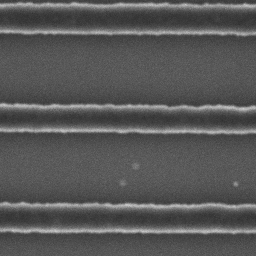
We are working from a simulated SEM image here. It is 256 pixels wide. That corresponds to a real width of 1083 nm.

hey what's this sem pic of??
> lines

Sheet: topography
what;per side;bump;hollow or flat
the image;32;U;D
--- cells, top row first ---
DDUUDDDDDUDDDDDDDDDDUDDDDDDDDDDD
UUUUUUUUUUUUUUUUUUUUUUUUUUUUUUUU
UUUUUUUUUUUUUUUUUUUUUUUUUUUUUUUU
UUUUUUUUUUUUUUUUUUUUUUUUUUUUUUUU
DDDDDDDDDDDDDDDDDDDDDDDDDDDDDDDD
DDDDDDDDDDDDDDDDDDDDDDDDDDDDDDDD
DDDDDDDDDDDDDDDDDDDDDDDDDDDDDDDD
DDDDDDDDDDDDDDDDDDDDDDDDDDDDDDDD
DDDDDDDDDDDDDDDDDDDDDDDDDDDDDDDD
DDDDDDDDDDDDDDDDDDDDDDDDDDDDDDDD
DDDDDDDDDDDDDDDDDDDDDDDDDDDDDDDD
DDDDDDDDDDDDDDDDDDDDDDDDDDDDDDDD
DDDDDDDDDDDDDDDDDDDDDDDDDDDDDDDD
UUUUUUUUUUUUUUUUUUUUUUUUUUUUUUUU
UUUUUUUUUUUUUUUUUUUUUUUUUUUUUUUU
UUUUUUUUUUUUUUUUUUUUUUUUUUUUUUUU
DDDDDDDUDDDDDDUUDUUUUUUUUUUUUUUU
DDDDDDDDDDDDDDDDDDDDDDDDDDDDDDDD
DDDDDDDDDDDDDDDDDDDDDDDDDDDDDDDD
DDDDDDDDDDDDDDDDDDDDDDDDDDDDDDDD
DDDDDDDDDDDDDDDDDDDDDDDDDDDDDDDD
DDDDDDDDDDDDDDDDDDDDDDDDDDDDDDDD
DDDDDDDDDDDDDDDDDDDDDDDDDDDDDDDD
DDDDDDDDDDDDDDDDDDDDDDDDDDDDDDDD
DDDDDDDDDDDDDDDDDDDDDDDDDDDDDDDD
UUUUUUUUUUUUUUDUUDDDDDDDDUUUDDDD
UUUUUUUUUUUUUUUUUUUUUUUUUUUUUUUU
UUUUUUUUUUUUUUUUUUUUUUUUUUUUUUUU
UUUUUUUUUUUUUUUUUUUUUUUUUUUUUUUU
DDDDDDDDDDDDDDDDDDDDDDDDDDDDDDDD
DDDDDDDDDDDDDDDDDDDDDDDDDDDDDDDD
DDDDDDDDDDDDDDDDDDDDDDDDDDDDDDDD